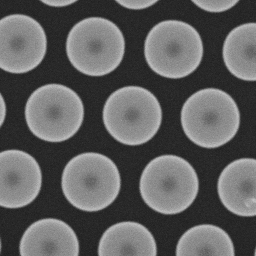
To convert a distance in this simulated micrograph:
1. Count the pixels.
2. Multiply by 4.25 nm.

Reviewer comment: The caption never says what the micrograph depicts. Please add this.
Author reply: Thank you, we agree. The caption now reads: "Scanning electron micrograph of an array of small figures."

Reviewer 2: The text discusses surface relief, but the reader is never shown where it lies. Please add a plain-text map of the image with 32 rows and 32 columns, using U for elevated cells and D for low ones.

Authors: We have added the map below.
DDDDDDUUUDDDDDDUUUUDDDDDUUUUUUDD
DDDDDDDDDDDDDDDDDDDDDDDDDDDDDDDD
UUUUDDDDDDUUUUDDDDDDDDDDDDDDDDDD
UUUUUDDDDUUUUUUDDDDUUUUUDDDDDUUU
UUUUUUDDUUUUUUUDDDUUUUUUUDDDUUUU
UUUUUUDDUUUUUUUUDDUUUUUUUDDDUUUU
UUUUUUDDUUUUUUUUDDUUUUUUUDDDUUUU
UUUUUDDDDUUUUUUDDDUUUUUUUDDDUUUU
UUUUDDDDDUUUUUUDDDDUUUUUUDDDUUUU
DDDDDDDDDDDDUDDDDDDDUUUDDDDDDUUU
DDDDDDDDDDDDDDDDDDDDDDDDDDDDDDDD
DDDDUUUUUDDDDDUUUUUDDDDDDUUUDDDD
DDDUUUUUUUDDDUUUUUUUDDDUUUUUUDDD
UDDUUUUUUUDDDUUUUUUUDDDUUUUUUUDD
UDDUUUUUUUDDDUUUUUUUDDDUUUUUUUDD
DDDUUUUUUUDDDUUUUUUUDDDUUUUUUUDD
DDDDUUUUUUDDDDUUUUUUDDDUUUUUUUDD
DDDDDUUUDDDDDDDUUUUDDDDDUUUUUDDD
DDDDDDDDDDDDDDDDDDDDDDDDDDUDDDDD
UUUUDDDDDDUUUDDDDDDDUUDDDDDDDDDD
UUUUUDDDUUUUUUDDDDUUUUUUDDDDDUUU
UUUUUDDDUUUUUUUDDDUUUUUUDDDDUUUU
UUUUUDDDUUUUUUUDDDUUUUUUUDDUUUUU
UUUUUDDDUUUUUUUDDUUUUUUUUDDUUUUU
UUUUUDDDUUUUUUUDDDUUUUUUUDDUUUUU
UUUUDDDDDUUUUUDDDDUUUUUUDDDDUUUU
DDDDDDDDDDDDDDDDDDDDUUUDDDDDDUUU
DDDDDUUDDDDDDDDDDDDDDDDDDDDDDDDD
DDDUUUUUUDDDDDUUUUDDDDDDUUUUDDDD
DDDUUUUUUUDDDUUUUUUDDDDUUUUUUDDD
DDUUUUUUUUDDUUUUUUUDDDUUUUUUUDDD
DDUUUUUUUUDDUUUUUUUUDDUUUUUUUDDD